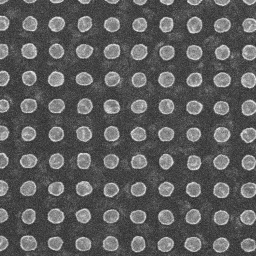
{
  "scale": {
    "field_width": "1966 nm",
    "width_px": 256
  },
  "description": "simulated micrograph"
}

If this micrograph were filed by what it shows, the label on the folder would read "a regular array of raised bodies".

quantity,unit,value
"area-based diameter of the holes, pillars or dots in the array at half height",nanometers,111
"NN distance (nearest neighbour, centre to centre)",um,0.208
